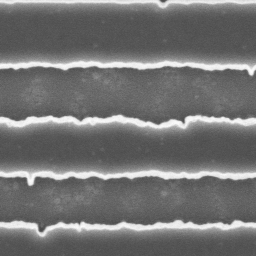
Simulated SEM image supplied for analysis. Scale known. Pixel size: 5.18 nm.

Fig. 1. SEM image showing one or a few lines or trenches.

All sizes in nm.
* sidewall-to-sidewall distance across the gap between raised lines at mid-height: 262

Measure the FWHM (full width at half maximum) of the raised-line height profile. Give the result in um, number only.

0.298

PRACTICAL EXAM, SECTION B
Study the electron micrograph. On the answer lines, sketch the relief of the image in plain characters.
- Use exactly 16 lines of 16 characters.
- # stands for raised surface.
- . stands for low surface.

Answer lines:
################
################
################
################
................
................
................
#.###.##....####
################
################
################
................
................
................
################
################